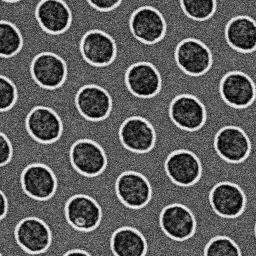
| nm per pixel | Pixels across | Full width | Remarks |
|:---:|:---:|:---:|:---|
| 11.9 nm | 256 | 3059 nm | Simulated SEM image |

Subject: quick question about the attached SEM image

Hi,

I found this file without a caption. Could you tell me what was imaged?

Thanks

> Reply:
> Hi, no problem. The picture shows a regular array of raised bodies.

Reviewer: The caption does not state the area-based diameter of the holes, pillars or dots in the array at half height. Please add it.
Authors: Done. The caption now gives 34.1 pixels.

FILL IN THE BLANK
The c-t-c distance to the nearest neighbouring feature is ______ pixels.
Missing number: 54.4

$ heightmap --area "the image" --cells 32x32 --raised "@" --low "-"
-----@@@---@@@@--------@@@@-----
-----@@@@--------@@@---@@@@-----
-----@@@@-------@@@@---------@@-
@@----@@--------@@@@@-------@@@@
@@@--------@@----@@@--------@@@@
@@@-------@@@@---------@@----@@@
@@--------@@@@--------@@@@------
----@@@@---@@@--------@@@@------
----@@@@--------@@@----@@@------
----@@@@--------@@@@--------@@@-
@@---@@@--------@@@@--------@@@@
@@--------@@@----@@@--------@@@@
@@--------@@@@--------@@@---@@@@
@----@----@@@@-------@@@@-------
----@@@----@@--------@@@@@------
---@@@@@--------@@----@@@-------
----@@@@-------@@@@--------@@@--
@----@@--------@@@@--------@@@@-
@--------@@@----@@@--------@@@@-
@--------@@@@--------@@@----@@@-
---------@@@@--------@@@@-------
---@@@----@@---------@@@@-------
---@@@@--------@@@----@@@-------
---@@@@--------@@@@--------@@@--
----@@---------@@@@-------@@@@--
@-------@@@@----@@---------@@@--
@-------@@@@@-------@@@@---@@@--
---@@----@@@--------@@@@--------
--@@@@----@@--------@@@@--------
--@@@@--------@@@@---@@@--------
--@@@@--------@@@@--------@@@---
----@----@----@@@@--------@@@@--